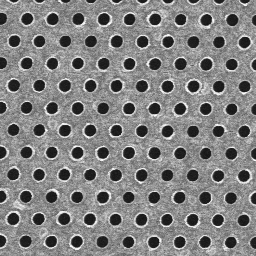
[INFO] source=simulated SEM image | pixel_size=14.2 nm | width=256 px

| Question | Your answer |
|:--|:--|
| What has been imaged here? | a regular array of holes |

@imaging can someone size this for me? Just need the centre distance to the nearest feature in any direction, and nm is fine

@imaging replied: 357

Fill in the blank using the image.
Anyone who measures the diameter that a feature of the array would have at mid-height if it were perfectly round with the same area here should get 169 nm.